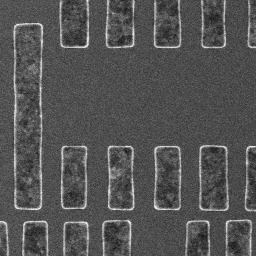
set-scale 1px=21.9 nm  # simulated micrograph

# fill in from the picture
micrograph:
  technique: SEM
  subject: wiring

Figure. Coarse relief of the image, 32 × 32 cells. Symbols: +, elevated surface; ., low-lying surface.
........+++..++++..+++...+++...+
.......++++..++++..+++...+++...+
........+++..++++..++++..+++...+
..+++...+++..++++..++++..+++...+
..+++...+++..++++..++++..+++...+
..+++...+++..++++..++++..+++...+
..+++...........................
..+++...........................
..+++...........................
..+++...........................
..+++...........................
..+++...........................
..+++...........................
..+++...........................
..+++...........................
..+++...........................
..+++...........................
..+++...........................
..+++...+++...++....++...+++...+
..+++...+++...+++..++++..+++...+
..+++...+++...+++..++++..+++...+
..+++...+++...+++..++++..+++...+
..+++...+++...+++..++++..+++...+
..+++...+++...+++..++++..+++...+
..+++...+++...+++..++++..++++..+
..+++...+++...+++..++++..++++..+
................................
..............................+.
+..+++..+++..+++.......+++..+++.
+..+++..+++..+++.......+++..+++.
+..+++..+++..+++.......+++..+++.
+..+++..+++..+++.......+++..+++.